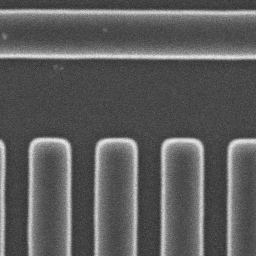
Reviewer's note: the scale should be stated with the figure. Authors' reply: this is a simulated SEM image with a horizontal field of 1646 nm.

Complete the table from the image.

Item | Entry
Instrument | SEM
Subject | groups of lines, slits or small figures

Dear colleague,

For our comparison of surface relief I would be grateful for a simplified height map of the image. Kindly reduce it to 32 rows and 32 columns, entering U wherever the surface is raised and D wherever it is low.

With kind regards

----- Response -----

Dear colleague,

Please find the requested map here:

DDDDDDDDDDDDDDDDDDDDDDDDDDDDDDDD
UUUUUUUUUUUUDDDDDDDDDDDDDDDDDDDD
UUUUUUUUUUUUUUUUUUUUUUUUUUUUUUUU
UUUUUUUUUUUUUUUUUUUUUUUUUUUUUUUU
UUUUUUUUUUUUUUUUUUUUUUUUUUUUUUUU
UUUUUUUUUUUUUUUUUUUUUUUUUUUUUUUU
UUUUUUUUUUUUUUUUUUUUUUUUUUUUUUUU
DDDDDDDDDDDDDDDDDDDDDDDDDDDDDDDD
DDDDDDDDDDDDDDDDDDDDDDDDDDDDDDDD
DDDDDDDDDDDDDDDDDDDDDDDDDDDDDDDD
DDDDDDDDDDDDDDDDDDDDDDDDDDDDDDDD
DDDDDDDDDDDDDDDDDDDDDDDDDDDDDDDD
DDDDDDDDDDDDDDDDDDDDDDDDDDDDDDDD
DDDDDDDDDDDDDDDDDDDDDDDDDDDDDDDD
DDDDDDDDDDDDDDDDDDDDDDDDDDDDDDDD
DDDDDDDDDDDDDDDDDDDDDDDDDDDDDDDD
DDDDDDDDDDDDDDDDDDDDDDDDDDDDDDDD
DDDDDDDDDDDDDDDDDDDDDDDDDDDDDDDD
DDDDUUUUUDDDUUUUUDDDUUUUUDDDDUUU
DDDDUUUUUDDDUUUUUDDDUUUUUDDDDUUU
DDDDUUUUUDDDUUUUUDDDUUUUUDDDDUUU
DDDDUUUUUDDDUUUUUDDDUUUUUDDDDUUU
DDDDUUUUUDDDUUUUUDDDUUUUUDDDDUUU
DDDDUUUUUDDDUUUUUDDDUUUUUDDDDUUU
DDDDUUUUUDDDUUUUUDDDUUUUUDDDDUUU
DDDDUUUUUDDDUUUUUDDDUUUUUDDDDUUU
DDDDUUUUUDDDUUUUUDDDUUUUUDDDDUUU
DDDDUUUUUDDDUUUUUDDDUUUUUDDDDUUU
DDDDUUUUUDDDUUUUUDDDUUUUUDDDDUUU
DDDDUUUUUDDDUUUUUDDDUUUUUDDDDUUU
DDDDUUUUUDDDUUUUUDDDUUUUUDDDDUUU
DDDDUUUUUDDDUUUUUDDDUUUUUDDDDUUU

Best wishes